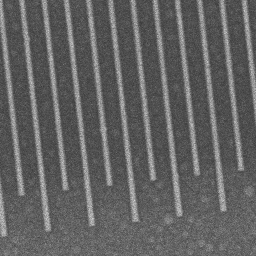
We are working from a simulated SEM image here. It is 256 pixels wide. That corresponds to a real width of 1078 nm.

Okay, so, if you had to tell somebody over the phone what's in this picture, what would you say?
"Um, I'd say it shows parallel lines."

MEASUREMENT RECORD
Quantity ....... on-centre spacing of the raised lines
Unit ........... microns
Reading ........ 0.0929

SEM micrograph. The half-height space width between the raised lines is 72.7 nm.